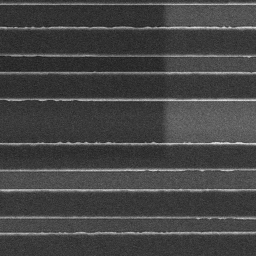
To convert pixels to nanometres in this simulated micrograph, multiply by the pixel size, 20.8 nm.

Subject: lines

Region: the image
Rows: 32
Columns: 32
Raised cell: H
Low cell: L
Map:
HHHHHHHHHHHHHHHHHHHHHHHHHHHHHHHH
LLLLLLLLLLLLLLLLLLLLLLLLLLLLLLLL
LLLLLLLLLLLLLLLLLLLLLLLLLLLLLLLL
HLLLLLHHHHHHHLHHHLHHHHHHHHHHHHHH
HHHHHHHHHHHHHHHHHHHHHHHHHHHHHHHH
HHHHHHHHHHHHHHHHHHHHHHHHHHHHHHHH
HHHHHHHHHHHHHHHHHHHHHHHHHHHHHHHH
LLLLLLLLLLLLLLLLLLLLLLLLLLLLLLLL
LLLLLLLLLLLLLLLLLLLLLLLLLLLLLLLL
HHHHHHHHHHHHHHHHHHHHHHHHHHHHHHHH
HHHHHHHHHHHHHHHHHHHHHHHHHHHHHHHH
HHHHHHHHHHHHHHHHHHHHHHHHHHHHHHHH
HHHLLHHHHHHHHHHHHHHHHHHHHHHHHHHH
LLLLLLLLLLLLLLLLLLLLLLLLLLLLLLLL
LLLLLLLLLLLLLLLLLLLLLLLLLLLLLLLL
LLLLLLLLLLLLLLLLLLLLLLLLLLLLLLLL
LLLLLLLLLLLLLLLLLLLLLLLLLLLLLLLL
LLLLLLLLLLLLLLLLLLLLLLLLLLLLLLLL
HHHHHHHHHHHHHHHHHHHHHHHHHHHHHHHH
HHHHHHHHHHHHHHHHHHHHHHHHHHHHHHHH
HHHHHHHHHHHHHHHHHHHHHHHHHHHHHHHH
LLLLLLLLLLLLLLLLLLLLLLLLLLLLLLLL
LLLLLLLLLLLLLLLLLLLLLLLLLLLLLLLL
LLLLLLLLLLLLLLLLLLLLLLLLLLLLLLLL
HHHHHHHHHHHHHHHHHHHHHHHHHHHHHHHH
HHHHHHHHHHHHHHHHHHHHHHHHHHHHHHHH
HHHHHHHHHHHHHHHHHHHHHHHHHHHHHHHH
LLLLLLLLLLLLLLLLLLLLLLLLLLLLLLLL
LLLLLLLLLLLLLLLLLLLLLLLLLLLLLLLL
HHHHHHHHHHHHHHHHHHHHHHHHHHHHHHHH
HHHHHHHHHHHHHHHHHHHHHHHHHHHHHHHH
HHHHHHHHHHHHHHHHHHHHHHHHHHHHHHHH